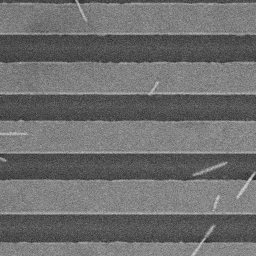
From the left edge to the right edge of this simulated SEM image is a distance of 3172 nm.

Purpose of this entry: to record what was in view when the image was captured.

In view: lines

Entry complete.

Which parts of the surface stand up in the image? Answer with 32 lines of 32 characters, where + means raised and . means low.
+++++++.++++++++++++++++++++++++
++++++++++++++++++++++++++++++++
++++++++++++++++++++++++++++++++
++++++++++++++++++++++++++++++++
................................
................................
................................
................................
++++++++++++++++++++++++++++++++
++++++++++++++++++++++++++++++++
++++++++++++++++++++++++++++++++
++++++++++++++++++++++++++++++++
................................
................................
................................
++++++++++++++++++++++++++++++++
++++++++++++++++++++++++++++++++
++++++++++++++++++++++++++++++++
++++++++++++++++++++++++++++++++
................................
................................
................................
...............................+
++++++++++++++++++++++++++++++++
++++++++++++++++++++++++++++++++
++++++++++++++++++++++++++++++++
++++++++++++++++++++++++++++++++
................................
................................
................................
++++++++++++++++++++++++++++++++
++++++++++++++++++++++++++++++++